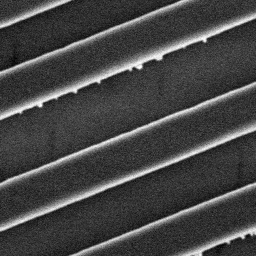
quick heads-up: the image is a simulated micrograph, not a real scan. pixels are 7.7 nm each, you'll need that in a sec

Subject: lines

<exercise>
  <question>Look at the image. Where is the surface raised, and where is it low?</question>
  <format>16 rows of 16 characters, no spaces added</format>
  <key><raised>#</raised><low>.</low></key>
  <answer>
###.......######
#.......#######.
.....########...
...#######......
#######.........
#####..........#
##..........####
..........######
.......########.
.....########...
..########......
#######.........
#####........###
##.........#####
........########
......#######...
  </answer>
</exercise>